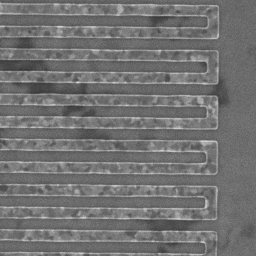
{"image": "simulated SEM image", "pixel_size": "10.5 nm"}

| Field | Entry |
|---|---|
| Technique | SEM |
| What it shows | groups of lines, slits or small figures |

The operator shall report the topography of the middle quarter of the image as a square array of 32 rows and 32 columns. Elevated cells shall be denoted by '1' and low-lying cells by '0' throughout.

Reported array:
00000000000000000000000000000000
00000000000000000000000000000000
11111111111111111111111111111111
11111111111111111111111111111111
01111111111111111111111111111111
00000000000000000000000000000000
00000000000000000000000000000000
00000000000000000000000000000000
11111111111111111111111111111111
11111111111111111111111111111110
00000000000000000000000000000000
00000000000000000000000000000000
00000000000000000000000000000000
11111111100000000000000000000000
11111111111111111111111111111111
11111111111111111111111111111111
00000000000000000000000000000000
00000000000000000000000000000000
00000000000000000000000000000000
11111111111111111111111111111111
11111111111111111111111111111111
11111111111111111111111111111111
00000000000000000000000000000000
00000000000000000000000000000000
00000000000000000000000000000000
11111111111111111111111111111111
11111111111111111111111111111111
00000000000000000000000000000000
00000000000000000000000000000000
00000000000000000000000000000000
11111111111000000000000000000000
11111111111111111111111111111111